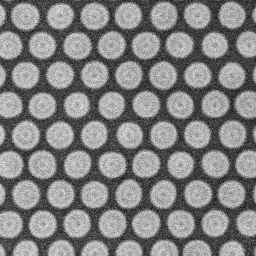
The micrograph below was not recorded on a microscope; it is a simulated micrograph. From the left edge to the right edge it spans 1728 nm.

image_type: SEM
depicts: an array of small figures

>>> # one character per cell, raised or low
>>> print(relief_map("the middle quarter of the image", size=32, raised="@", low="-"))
@----@@@@@----@@@@@---@@@@@----@
@@---@@@@@@--@@@@@@---@@@@@@---@
@@--@@@@@@@--@@@@@@--@@@@@@@--@@
@@---@@@@@@--@@@@@@--@@@@@@@--@@
@@---@@@@@---@@@@@@---@@@@@@---@
@-----@@@-----@@@@-----@@@@-----
--------------------------------
--@@@------@@@-----@@@-----@@@@-
-@@@@@---@@@@@@---@@@@@---@@@@@@
@@@@@@---@@@@@@--@@@@@@@--@@@@@@
@@@@@@---@@@@@@--@@@@@@@--@@@@@@
@@@@@@---@@@@@@---@@@@@@--@@@@@@
-@@@@----@@@@@----@@@@@----@@@@@
-----------@@---------------@@--
-------@@---------------@@------
@----@@@@@----@@@@@----@@@@----@
@@---@@@@@@--@@@@@@---@@@@@@--@@
@@--@@@@@@@--@@@@@@---@@@@@@--@@
@@--@@@@@@@--@@@@@@---@@@@@@--@@
@@---@@@@@----@@@@@---@@@@@@---@
@----@@@@------@@@-----@@@@-----
--------------------------------
-@@@@@----@@@@----@@@@@----@@@@-
-@@@@@---@@@@@@---@@@@@@--@@@@@@
@@@@@@@--@@@@@@--@@@@@@@--@@@@@@
@@@@@@@--@@@@@@--@@@@@@@--@@@@@@
@@@@@@---@@@@@@--@@@@@@@--@@@@@@
-@@@@@----@@@@@---@@@@@----@@@@-
--@@----------------------------
@------@-------@@@------@@------
@@---@@@@@----@@@@@---@@@@@@---@
@@---@@@@@@--@@@@@@---@@@@@@--@@